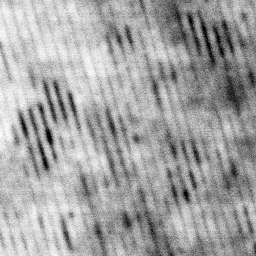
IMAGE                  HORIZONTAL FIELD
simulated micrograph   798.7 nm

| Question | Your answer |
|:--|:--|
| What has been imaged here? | parallel lines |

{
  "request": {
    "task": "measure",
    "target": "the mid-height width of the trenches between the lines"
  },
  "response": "10.5 nm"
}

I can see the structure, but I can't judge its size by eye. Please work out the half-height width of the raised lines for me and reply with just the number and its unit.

0.0232 micrometres